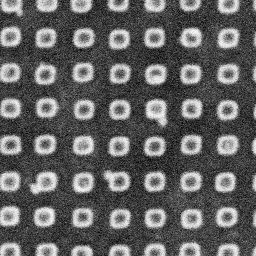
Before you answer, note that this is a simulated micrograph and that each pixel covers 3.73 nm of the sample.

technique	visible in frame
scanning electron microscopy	a regular array of raised bodies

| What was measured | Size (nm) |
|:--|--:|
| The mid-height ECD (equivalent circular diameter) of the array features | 70.2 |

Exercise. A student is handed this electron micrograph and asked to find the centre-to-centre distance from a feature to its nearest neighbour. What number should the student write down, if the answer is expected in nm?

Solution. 130